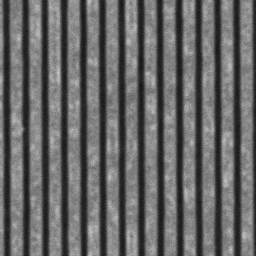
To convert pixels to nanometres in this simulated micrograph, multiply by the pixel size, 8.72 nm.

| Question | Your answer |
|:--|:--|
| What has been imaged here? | parallel lines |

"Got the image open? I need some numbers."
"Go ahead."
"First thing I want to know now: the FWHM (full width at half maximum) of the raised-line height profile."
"0.0959 microns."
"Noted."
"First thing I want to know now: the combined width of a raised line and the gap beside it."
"167 nm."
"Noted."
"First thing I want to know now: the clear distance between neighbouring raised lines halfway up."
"7.63 px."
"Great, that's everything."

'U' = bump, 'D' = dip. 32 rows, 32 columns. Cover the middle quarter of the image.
DUUUDDUUDDDUUDDDUUDDUUUDDUUUDDUU
DUUUDDUUDDDUUDDDUUDDUUUDDUUUDDUU
DUUUDDUUDDDUUDDUUUDDUUUDDUUUDDUU
DUUUDDUUUDDUUDDUUUDDUUUDDUUUDDUU
DUUUDDUUUDDUUDDDUUDDUUUDDUUUDDUU
DUUUDDUUUDDUUDDDUUDDUUUDDUUUDDUU
DUUUDDUUUDDUUDDDUUDDUUUDDUUUDDUU
DUUUDDUUUDDUUDDDUUDDUUUDDUUUDDUU
DUUUDDUUUDDUUDDDUUDDUUUDDUUUDDUU
DUUUDDUUUDDUUDDDUUDDUUUDDUUUDDUU
DUUUDDUUUDDUUDDDUUDDUUUDDUUUDDUU
DUUUDDUUUDDUUDDDUUDDUUUDDUUUDDUU
DUUUDDUUUDDUUDDDUUDDDUUDDUUUDDUU
DUUUDDUUUDDUUDDDUUDDUUUDDUUUDDUU
DUUUDDUUUDDUUDDDUUDDUUUDDUUUDDUU
DUUUDDUUUDDUUDDDUUDDUUUDDUUUDDUU
DUUUDDUUUDDUUDDDUUDDUUUDDUUUDDUU
DUUUDDUUUDDUUDDDUUDDUUUDDUUUDDUU
DUUUDDUUUDDUUUDDUUDDUUUDDUUUDDUU
DUUUDDUUUDDUUDDDUUDDUUUDDUUUDDUU
DUUUDDUUUDDUUDDDUUDDUUUDDUUUDDUU
DUUUDDUUUDDUUDDDUUDDUUUDDUUUDDUU
DUUUDDUUUDDUUUDDUUDDDUUDDUUUDDUU
DUUUDDUUUDDUUDDDUUDDDUUDDUUUDDUU
DUUUDDUUUDDUUDDDUUDDUUUDDUUUDDUU
DUUUDDUUUDDUUDDDUUDDUUUDDUUUDDUU
DUUUDDUUUDDUUDDDUUDDUUUDDUUUDDUU
DUUUDDUUUDDUUDDDUUDDUUUDDUUUDDUU
DUUUDDUUUDDUUDDDUUDDUUUDDUUUDDUU
DUUUDDUUUDDUUDDDUUDDUUUDDUUUDDUU
DUUUDDUUUDDUUDDDUUDDDUUDDUUUDDUU
DUUUDDUUUDDUUDDDUUDDDUUDDUUUDDUU